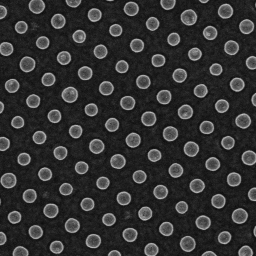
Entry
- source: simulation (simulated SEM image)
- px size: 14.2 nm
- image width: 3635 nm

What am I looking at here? a regular array of raised bodies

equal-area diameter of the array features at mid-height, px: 13.4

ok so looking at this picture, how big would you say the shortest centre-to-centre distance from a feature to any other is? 369 nm